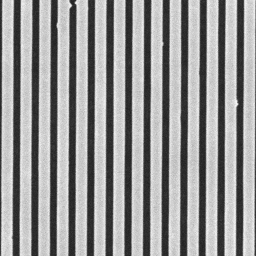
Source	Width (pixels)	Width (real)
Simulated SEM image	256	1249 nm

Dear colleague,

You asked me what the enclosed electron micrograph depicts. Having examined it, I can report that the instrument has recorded parallel lines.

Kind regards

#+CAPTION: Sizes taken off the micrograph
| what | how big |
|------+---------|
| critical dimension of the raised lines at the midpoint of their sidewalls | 0.0567 micrometres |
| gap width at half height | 0.0348 um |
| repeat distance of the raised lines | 0.0908 um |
